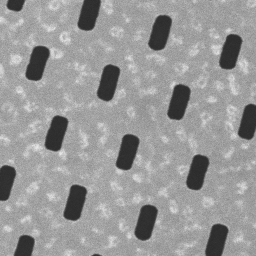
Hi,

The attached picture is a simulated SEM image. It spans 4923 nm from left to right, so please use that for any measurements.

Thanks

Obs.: a regular array of holes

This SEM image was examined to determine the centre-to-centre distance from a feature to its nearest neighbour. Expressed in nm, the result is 1380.